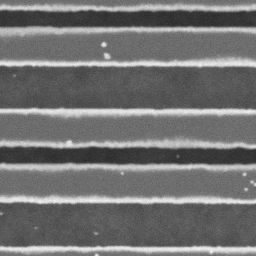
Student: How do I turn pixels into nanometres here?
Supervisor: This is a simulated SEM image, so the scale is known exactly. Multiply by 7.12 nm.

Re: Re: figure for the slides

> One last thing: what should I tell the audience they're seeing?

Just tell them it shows lines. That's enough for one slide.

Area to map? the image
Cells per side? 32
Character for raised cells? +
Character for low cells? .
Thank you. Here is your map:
++++++++++++++++++++++++++++++++
................................
................................
....+++........+++++++++++++++..
++++++++++++++++++++++++++++++++
++++++++++++++++++++++++++++++++
++++++++++++++++++++++++++++++++
++++++++++++++++++++++++++++++++
................................
................................
................................
................................
................................
................................
++++++++++++++++++++++++++++++++
++++++++++++++++++++++++++++++++
++++++++++++++++++++++++++++++++
++++++++++++++++++++++++++++++++
...............................+
................................
................................
++++++++++++++++++++++++++++++++
++++++++++++++++++++++++++++++++
++++++++++++++++++++++++++++++++
++++++++++++++++++++++++++++++++
................................
................................
................................
................................
................................
................................
++++++++++++++++++++++++++++++++